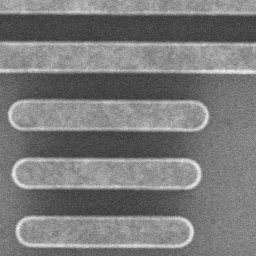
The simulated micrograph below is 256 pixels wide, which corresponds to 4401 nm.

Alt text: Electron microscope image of groups of lines, slits or small figures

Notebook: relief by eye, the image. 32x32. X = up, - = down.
XXXXXXXXXXXXXXXXXXXXXXXXXXXXXXXX
XXXXXXXXXXXXXXXXXXXXXXXXXXXXXXXX
--------------------------------
--------------------------------
--------------------------------
XXXXXXXXXXXXXXXXXXXXXXXXXXXXXXXX
XXXXXXXXXXXXXXXXXXXXXXXXXXXXXXXX
XXXXXXXXXXXXXXXXXXXXXXXXXXXXXXXX
XXXXXXXXXXXXXXXXXXXXXXXXXXXXXXXX
--------------------------------
--------------------------------
--------------------------------
--------------------------------
-XXXXXXXXXXXXXXXXXXXXXXXXX------
-XXXXXXXXXXXXXXXXXXXXXXXXX------
--XXXXXXXXXXXXXXXXXXXXXXXX------
--------------------------------
--------------------------------
--------------------------------
--------------------------------
--XXXXXXXXXXXXXXXXXXXXXX--------
--XXXXXXXXXXXXXXXXXXXXXXX-------
--XXXXXXXXXXXXXXXXXXXXXXX-------
-----------------XXXXXXX--------
--------------------------------
--------------------------------
--------------------------------
---XXXXXXXXXXXXXXXXXXXX---------
--XXXXXXXXXXXXXXXXXXXXXX--------
--XXXXXXXXXXXXXXXXXXXXXX--------
---XXXXXXXXXXXXXXXXXXXX---------
--------------------------------